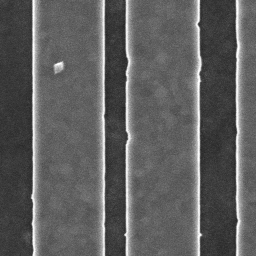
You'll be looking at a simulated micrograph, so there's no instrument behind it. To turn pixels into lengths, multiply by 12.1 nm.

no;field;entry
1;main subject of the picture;one or a few lines or trenches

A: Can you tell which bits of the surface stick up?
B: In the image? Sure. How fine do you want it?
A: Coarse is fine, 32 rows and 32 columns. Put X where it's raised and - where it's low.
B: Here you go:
----XXXXXXXXX---XXXXXXXXX-----XX
----XXXXXXXXX---XXXXXXXXX-----XX
----XXXXXXXXX---XXXXXXXXX-----XX
----XXXXXXXXX---XXXXXXXXX-----XX
----XXXXXXXXX---XXXXXXXXX-----XX
----XXXXXXXXX---XXXXXXXXX-----XX
----XXXXXXXXX---XXXXXXXXX-----XX
----XXXXXXXXX---XXXXXXXXX-----XX
----XXXXXXXXX---XXXXXXXXX-----XX
----XXXXXXXXX---XXXXXXXXX-----XX
----XXXXXXXXX---XXXXXXXXX-----XX
----XXXXXXXXX---XXXXXXXXX-----XX
----XXXXXXXXX---XXXXXXXXX-----XX
----XXXXXXXXX---XXXXXXXXX-----XX
----XXXXXXXXX---XXXXXXXXX-----XX
----XXXXXXXXX---XXXXXXXXX-----XX
----XXXXXXXXX---XXXXXXXXX-----XX
----XXXXXXXXX---XXXXXXXXX-----XX
----XXXXXXXXX---XXXXXXXXX-----XX
----XXXXXXXXX---XXXXXXXXX-----XX
----XXXXXXXXX---XXXXXXXXX-----XX
----XXXXXXXXX---XXXXXXXXX-----XX
----XXXXXXXXX---XXXXXXXXX-----XX
----XXXXXXXXX---XXXXXXXXX-----XX
----XXXXXXXXX---XXXXXXXXX-----XX
----XXXXXXXXX---XXXXXXXXX-----XX
----XXXXXXXXX---XXXXXXXXX-----XX
----XXXXXXXXX---XXXXXXXXX-----XX
----XXXXXXXXX---XXXXXXXXX-----XX
----XXXXXXXXX---XXXXXXXXX-----XX
----XXXXXXXXX---XXXXXXXXX-----XX
----XXXXXXXXX---XXXXXXXXX-----XX